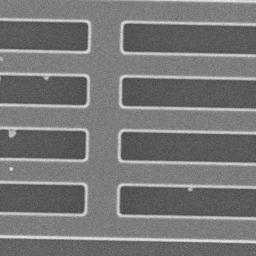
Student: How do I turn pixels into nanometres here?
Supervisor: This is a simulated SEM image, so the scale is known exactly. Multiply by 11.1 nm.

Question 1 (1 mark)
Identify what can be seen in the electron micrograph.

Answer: groups of lines, slits or small figures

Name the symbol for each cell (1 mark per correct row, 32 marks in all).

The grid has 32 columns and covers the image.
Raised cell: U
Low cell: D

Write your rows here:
UUUUUUUUUUUUUUUUUUUUUUUUUUUUUUUU
UUUUUUUUUUUUUUUUUUUUUUUUUUUUUUUU
DDDDUUUUUUUUUUUUUUUUUUUUUUUUUUUU
DDDDDDDDDDDUUUUDDDDDDDDDDDDDDDDD
DDDDDDDDDDDUUUUDDDDDDDDDDDDDDDDD
DDDDDDDDDDDUUUUDDDDDDDDDDDDDDDDD
UUUUUUUUUUUUUUUUDDDDDDDDDDDDDDDD
UUUUUUUUUUUUUUUUUUUUUUUUUUUUUUUU
UUUUUUUUUUUUUUUUUUUUUUUUUUUUUUUU
DDDDDDDDDDUUUUUUUUUUUUUUUUUUUUUU
DDDDDDDDDDDUUUUDDDDDDDDDDDDDDDDD
DDDDDDDDDDDUUUUDDDDDDDDDDDDDDDDD
DDDDDDDDDDDUUUUDDDDDDDDDDDDDDDDD
UUUUUUUUUUUUUUUUUUUUUUUDDDDDDDDD
UUUUUUUUUUUUUUUUUUUUUUUUUUUUUUUU
UUUUUUUUUUUUUUUUUUUUUUUUUUUUUUUU
DDDDDDDDDDDUUUUDDDDDDDUUUUUUUUUU
DDDDDDDDDDDUUUUDDDDDDDDDDDDDDDDD
DDDDDDDDDDDUUUUDDDDDDDDDDDDDDDDD
DDDDDDDDDDDUUUUDDDDDDDDDDDDDDDDD
UUUUUUUUUUUUUUUUUUUUUUUUUUUUUUDD
UUUUUUUUUUUUUUUUUUUUUUUUUUUUUUUU
UUUUUUUUUUUUUUUUUUUUUUUUUUUUUUUU
DDDDDDDDDDDUUUUDDDDDDDDDDDDDDDDD
DDDDDDDDDDDUUUUDDDDDDDDDDDDDDDDD
DDDDDDDDDDDUUUUDDDDDDDDDDDDDDDDD
DDDDDDDDDDUUUUUDDDDDDDDDDDDDDDDD
UUUUUUUUUUUUUUUUUUUUUUUUUUUUUUUU
UUUUUUUUUUUUUUUUUUUUUUUUUUUUUUUU
UUUUUUUUUUUUUUUUUUUUUUUUUUUUUUUU
DDDDDDDDDDDDDDDDDDDDDDDDDDDDDDDD
DDDDDDDDDDDDDDDDDDDDDDDDDDDDDDDD